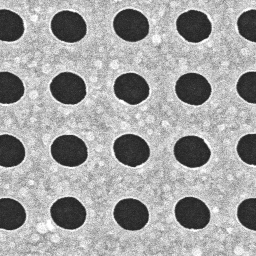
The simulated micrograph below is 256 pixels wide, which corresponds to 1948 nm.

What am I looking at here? a regular array of holes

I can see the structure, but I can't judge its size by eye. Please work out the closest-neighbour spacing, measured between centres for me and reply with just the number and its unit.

470 nanometers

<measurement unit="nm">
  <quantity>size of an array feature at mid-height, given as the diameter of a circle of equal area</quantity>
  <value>264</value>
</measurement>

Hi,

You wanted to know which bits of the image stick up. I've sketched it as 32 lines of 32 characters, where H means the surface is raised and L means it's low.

HHHHHHHHHHHHHHHHHHHHHHHHHHHHHHHH
LLHHHHHLLHHHHHHLLLHHHHHLLHHHHHHL
LLLHHHLLLLLHHHLLLLHHHHLLLLHHHHLL
LLLHHHLLLLLHHHLLLLLHHHLLLLHHHHLL
LLLHHHHLLLLHHHHLLLHHHHHLLLHHHHLL
HHHHHHHHHHHHHHHHHHHHHHHHHHHHHHHH
HHHHHHHHHHHHHHHHHHHHHHHHHHHHHHHH
HHHHHHHHHHHHHHHHHHHHHHHHHHHHHHHH
HHHHHHHHHHHHHHHHHHHHHHHHHHHHHHHH
LLHHHHHLLLHHHHHLLLHHHHHLLHHHHHLL
LLLHHHLLLLLHHHLLLLHHHHLLLLHHHHLL
LLLHHHLLLLLHHHLLLLLHHHLLLLHHHHLL
LLHHHHHLLLHHHHHLLLHHHHLLLLHHHHLL
HHHHHHHHHHHHHHHHHHHHHHHHHHHHHHHH
HHHHHHHHHHHHHHHHHHHHHHHHHHHHHHHH
HHHHHHHHHHHHHHHHHHHHHHHHHHHHHHHH
HHHHHHHHHHHHHHHHHHHHHHHHHHHHHHHH
LLHHHHHLLLHHHHLLLLHHHHLLLHHHHHLL
LLLHHHLLLLLHHHLLLLLHHHLLLLHHHHLL
LLLHHHLLLLLHHHLLLLLHHHLLLLHHHHLL
LLHHHHHLLLHHHHHLLLHHHHHLLLHHHHHL
HHHHHHHHHHHHHHHHHHHHHHHHHHHHHHHH
HHHHHHHHHHHHHHHHHHHHHHHHHHHHHHHH
HHHHHHHHHHHHHHHHHHHHHHHHHHHHHHHH
HHHHHHHHHHHHHHHHHHHHHHHHHHHHHHHH
LLLHHHHLLLHHHHHLLLHHHHLLLLHHHHLL
LLLHHHLLLLLHHHLLLLLHHHLLLLHHHHLL
LLLHHHHLLLLHHHLLLLLHHHLLLLHHHHLL
LLHHHHHHLLHHHHHLLLHHHHHLLHHHHHHL
HHHHHHHHHHHHHHHHHHHHHHHHHHHHHHHH
HHHHHHHHHHHHHHHHHHHHHHHHHHHHHHHH
HHHHHHHHHHHHHHHHHHHHHHHHHHHHHHHH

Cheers